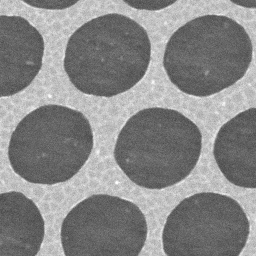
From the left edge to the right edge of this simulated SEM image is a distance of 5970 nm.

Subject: holes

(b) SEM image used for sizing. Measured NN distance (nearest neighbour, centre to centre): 103 pixels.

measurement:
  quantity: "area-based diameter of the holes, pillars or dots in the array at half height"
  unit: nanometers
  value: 1970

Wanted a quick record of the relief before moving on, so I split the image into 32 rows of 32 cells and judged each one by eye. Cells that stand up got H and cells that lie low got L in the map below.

HHHLLLLLLHHHHHHHLLLLLLHHHHHHHLLL
HHHHHHHHHHHHHHHHHHHHHHHHHHHHHHHH
LLLHHHHHHHHLLLLLLHHHHHHHLLLLLHHH
LLLLHHHHHHLLLLLLLLHHHHLLLLLLLLHH
LLLLLHHHHLLLLLLLLLLHHLLLLLLLLLLH
LLLLLLHHLLLLLLLLLLLHHLLLLLLLLLLL
LLLLLLHHLLLLLLLLLLLHHLLLLLLLLLLL
LLLLLHHHLLLLLLLLLLLHLLLLLLLLLLLH
LLLLLHHHLLLLLLLLLLHHHLLLLLLLLLLH
LLLLLHHHLLLLLLLLLLHHHLLLLLLLLLHH
LLLLHHHHHLLLLLLLLHHHHHLLLLLLLHHH
LLLHHHHHHHLLLLLLHHHHHHHLLLLHHHHH
HHHHHHHHHHHHHHHHHHHHHHHHHHHHHHHH
HHHHHLLLLHHHHHHHHHHLHHHHHHHHHHHH
HHHLLLLLLLLHHHHHLLLLLLLHHHHHHLLL
HHLLLLLLLLLHHHHHLLLLLLLLHHHHLLLL
HHLLLLLLLLLLHHHLLLLLLLLLLHHLLLLL
HLLLLLLLLLLLHHHLLLLLLLLLLHHLLLLL
HLLLLLLLLLLLHHLLLLLLLLLLLHHLLLLL
HLLLLLLLLLLHHHLLLLLLLLLLLHHLLLLL
HLLLLLLLLLLHHHHLLLLLLLLLLHHLLLLL
HHLLLLLLLLHHHHHLLLLLLLLLHHHHLLLL
HHHLLLLLLHHHHHHHLLLLLLLHHHHHLLLL
HHHHHHHHHHHHHHHHHHLLHHHHHHHHHHHL
LLLHHHHHHHHLLLHHHHHHHHHHLLLLLHHH
LLLLHHHHHHLLLLLLLHHHHHLLLLLLLLHH
LLLLLHHHHLLLLLLLLLHHHLLLLLLLLLLH
LLLLLHHHLLLLLLLLLLHHHLLLLLLLLLLH
LLLLLLHHLLLLLLLLLLHHLLLLLLLLLLLH
LLLLLLHHLLLLLLLLLLHHLLLLLLLLLLLH
LLLLLHHHLLLLLLLLLLHHLLLLLLLLLLLH
LLLLLHHHLLLLLLLLLLHHHLLLLLLLLLHH